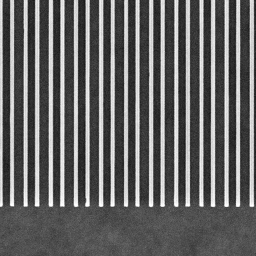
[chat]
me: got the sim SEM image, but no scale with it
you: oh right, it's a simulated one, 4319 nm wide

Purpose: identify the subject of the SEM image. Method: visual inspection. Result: parallel lines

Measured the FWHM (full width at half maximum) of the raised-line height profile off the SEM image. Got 44.3 nanometres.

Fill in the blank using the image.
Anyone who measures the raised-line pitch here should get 213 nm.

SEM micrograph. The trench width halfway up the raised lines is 0.163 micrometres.